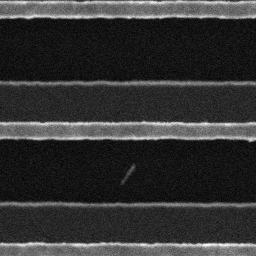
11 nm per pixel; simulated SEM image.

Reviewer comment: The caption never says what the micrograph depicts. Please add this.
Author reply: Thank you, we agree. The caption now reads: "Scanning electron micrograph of lines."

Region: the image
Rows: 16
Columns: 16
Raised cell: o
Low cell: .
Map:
oooooooooooooooo
................
................
................
................
oooooooooooooooo
oooooooooooooooo
oooooooooooooooo
oooooooooooooooo
................
................
................
................
oooooooooooooooo
oooooooooooooooo
oooooooooooooooo